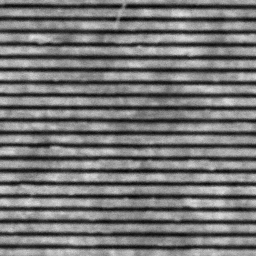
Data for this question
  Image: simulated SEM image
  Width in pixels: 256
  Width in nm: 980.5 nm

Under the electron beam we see parallel lines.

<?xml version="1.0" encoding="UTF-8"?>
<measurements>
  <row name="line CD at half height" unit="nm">27.8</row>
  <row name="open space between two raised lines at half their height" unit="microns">0.0206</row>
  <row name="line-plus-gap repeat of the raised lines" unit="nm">48.5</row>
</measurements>